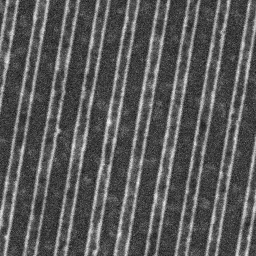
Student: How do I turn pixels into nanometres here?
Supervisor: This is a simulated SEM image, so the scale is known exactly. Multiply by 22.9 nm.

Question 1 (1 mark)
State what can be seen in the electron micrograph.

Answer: parallel lines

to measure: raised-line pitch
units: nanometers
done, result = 683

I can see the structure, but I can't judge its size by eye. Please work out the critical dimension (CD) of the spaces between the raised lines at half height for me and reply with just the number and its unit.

451 nm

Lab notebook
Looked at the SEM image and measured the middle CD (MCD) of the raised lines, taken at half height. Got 226 nanometers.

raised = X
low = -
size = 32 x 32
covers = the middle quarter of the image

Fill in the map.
X-----XX-----XXX-----XX-----XXX-
X-----XX-----XXX-----XX-----XXX-
X----XXX-----XX------XX-----XXX-
-----XXX-----XX-----XXX-----XXX-
-----XXX-----XX-----XXX-----XX--
-----XX------XX-----XX------XX--
-----XX-----XXX-----XXX----XXX--
-----XX-----XXX-----XX-----XXX--
----XXX-----XX------XX-----XXX--
----XXX-----XX-----XXX-----XXX--
----XXX-----XX-----XXX-----XX---
----XX------XX-----XXX-----XX---
----XX-----XXX-----XXX----XXX---
----XX-----XXX-----XX-----XXX---
---XXX-----XX------XX-----XXX---
---XXX-----XX-----XXX-----XXX---
---XXX-----XX-----XXX-----XX----
---XX------XX-----XXX-----XX----
---XX-----XXX-----XXX----XXX----
--XXX-----XXX-----XX-----XXX----
--XXX-----XX------XX-----XXX----
--XXX-----XX-----XXX-----XX-----
--XXX-----XX-----XXX-----XX-----
--XX------XX-----XX------XX-----
--XX------XX-----XX-----XXX-----
--XX-----XXX-----XX-----XXX-----
--XX-----XX------XX-----XXX-----
-XXX-----XX-----XXX-----XX------
-XXX-----XX-----XXX-----XX-----X
-XX------XX-----XX------XX-----X
-XX-----XXX-----XX-----XXX-----X
-XX-----XXX-----XX-----XXX-----X